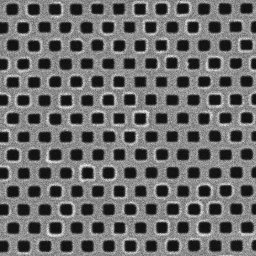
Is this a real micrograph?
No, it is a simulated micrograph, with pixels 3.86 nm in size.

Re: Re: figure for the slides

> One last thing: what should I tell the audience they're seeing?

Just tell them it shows a regular array of holes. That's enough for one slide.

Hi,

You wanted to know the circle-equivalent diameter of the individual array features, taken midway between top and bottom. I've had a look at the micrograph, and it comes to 49.1 nm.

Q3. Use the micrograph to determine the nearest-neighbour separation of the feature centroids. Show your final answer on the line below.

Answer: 80.3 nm